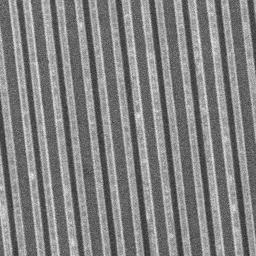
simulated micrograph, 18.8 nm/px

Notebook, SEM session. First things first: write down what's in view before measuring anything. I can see parallel lines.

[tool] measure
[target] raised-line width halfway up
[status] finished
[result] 124 nanometers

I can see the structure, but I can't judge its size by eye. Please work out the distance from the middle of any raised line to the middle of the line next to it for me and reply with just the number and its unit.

307 nm